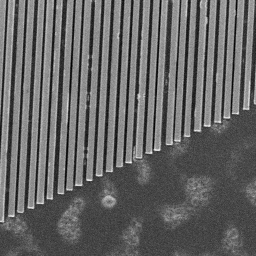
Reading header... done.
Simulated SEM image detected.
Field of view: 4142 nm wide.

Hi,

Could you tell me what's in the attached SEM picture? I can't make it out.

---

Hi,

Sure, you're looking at parallel lines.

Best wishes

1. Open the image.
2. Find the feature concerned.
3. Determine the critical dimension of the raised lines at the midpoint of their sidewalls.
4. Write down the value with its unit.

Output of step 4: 0.0949 µm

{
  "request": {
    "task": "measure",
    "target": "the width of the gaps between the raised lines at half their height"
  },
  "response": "54.5 nanometers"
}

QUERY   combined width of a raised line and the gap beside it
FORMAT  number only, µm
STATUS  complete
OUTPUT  0.155